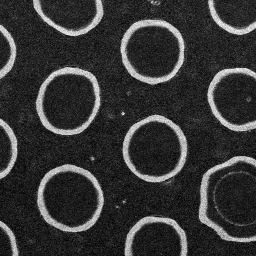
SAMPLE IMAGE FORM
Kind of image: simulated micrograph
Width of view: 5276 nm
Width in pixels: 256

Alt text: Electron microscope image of raised bodies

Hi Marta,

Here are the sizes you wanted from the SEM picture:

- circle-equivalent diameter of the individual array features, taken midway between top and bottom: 1260 nm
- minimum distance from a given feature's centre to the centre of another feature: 2.01 um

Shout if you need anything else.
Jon